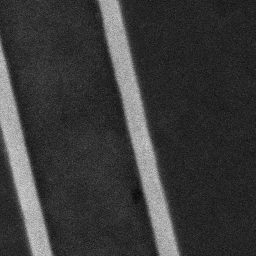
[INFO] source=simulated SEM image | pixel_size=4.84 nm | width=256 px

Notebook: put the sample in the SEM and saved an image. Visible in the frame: one or a few lines or trenches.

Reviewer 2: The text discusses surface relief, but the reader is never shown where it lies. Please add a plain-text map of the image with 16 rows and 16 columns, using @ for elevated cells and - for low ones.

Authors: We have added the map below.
-------@@@@@@@@@
-------@@@@@@@@@
-------@@@@@@@@@
--------@@@@@@@@
--------@@@@@@@@
--------@@@@@@@@
--------@@@@@@@@
@--------@@@@@@@
@--------@@@@@@@
@--------@@@@@@@
@--------@@@@@@@
@@--------@@@@@@
@@--------@@@@@@
@@--------@@@@@@
@@--------@@@@@@
@@@--------@@@@@